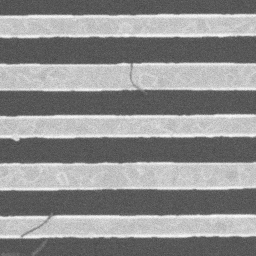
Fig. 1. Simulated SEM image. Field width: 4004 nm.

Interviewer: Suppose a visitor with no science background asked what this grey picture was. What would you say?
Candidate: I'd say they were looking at lines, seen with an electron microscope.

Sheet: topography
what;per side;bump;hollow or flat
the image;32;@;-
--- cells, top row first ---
--------------------------------
--------------------------------
@@@@@@@@@@@@@@@@@@@@@@@@@@@@@@@@
@@@@@@@@@@@@@@@@@@@@@@@@@@@@@@@@
@@@@@---------------------------
--------------------------------
--------------------------------
--------------------------------
@@@@@@@@@@@@@@@@@@@@@@@@@@@@@@@@
@@@@@@@@@@@@@@@@@@@@@@@@@@@@@@@@
@@@@@@@@@@@@@@@@@@@@@@@@@@@@@@@@
--------------------------------
--------------------------------
--------------------------------
---------------------------@@@@@
@@@@@@@@@@@@@@@@@@@@@@@@@@@@@@@@
@@@@@@@@@@@@@@@@@@@@@@@@@@@@@@@@
--------------------------------
--------------------------------
--------------------------------
---------------@-@@@@@@@@@@@@@@@
@@@@@@@@@@@@@@@@@@@@@@@@@@@@@@@@
@@@@@@@@@@@@@@@@@@@@@@@@@@@@@@@@
@@@@@@@@@@@@@@@@@@@@@@@@@@@@----
--------------------------------
--------------------------------
--------------------------------
@@@@@@@@@@@@@@@@@@@@@@@@@@@@@@@@
@@@@@@@@@@@@@@@@@@@@@@@@@@@@@@@@
@@@@@@@@@@@@@@@@@@@@@@@@--------
--------------------------------
--------------------------------